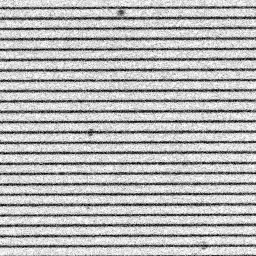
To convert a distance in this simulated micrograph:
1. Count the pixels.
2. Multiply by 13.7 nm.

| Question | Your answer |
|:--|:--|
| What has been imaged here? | parallel lines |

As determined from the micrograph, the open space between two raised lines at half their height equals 41.2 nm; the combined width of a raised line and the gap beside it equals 142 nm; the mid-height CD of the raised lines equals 105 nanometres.